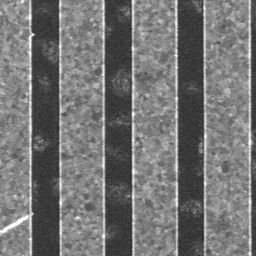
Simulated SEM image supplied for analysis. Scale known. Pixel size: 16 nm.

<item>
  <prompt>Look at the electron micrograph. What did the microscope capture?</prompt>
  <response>one or a few lines or trenches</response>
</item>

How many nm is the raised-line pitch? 1170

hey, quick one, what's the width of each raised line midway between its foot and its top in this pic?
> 699 nanometres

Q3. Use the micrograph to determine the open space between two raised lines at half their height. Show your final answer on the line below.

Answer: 0.467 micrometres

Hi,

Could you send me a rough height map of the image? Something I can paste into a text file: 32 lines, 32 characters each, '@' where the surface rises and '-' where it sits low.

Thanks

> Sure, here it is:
@@@@----@@@@@----@@@@@----@@@@@-
@@@@----@@@@@----@@@@@----@@@@@-
@@@@----@@@@@----@@@@@----@@@@@-
@@@@----@@@@@----@@@@@----@@@@@-
@@@@----@@@@@----@@@@@----@@@@@-
@@@@----@@@@@----@@@@@----@@@@@-
@@@@----@@@@@----@@@@@----@@@@@-
@@@@----@@@@@----@@@@@----@@@@@-
@@@@----@@@@@----@@@@@----@@@@@-
@@@@----@@@@@----@@@@@----@@@@@-
@@@@----@@@@@----@@@@@----@@@@@-
@@@@----@@@@@----@@@@@----@@@@@-
@@@@----@@@@@----@@@@@----@@@@@-
@@@@----@@@@@----@@@@@----@@@@@-
@@@@----@@@@@----@@@@@----@@@@@-
@@@@----@@@@@----@@@@@----@@@@@-
@@@@----@@@@@----@@@@@----@@@@@-
@@@@----@@@@@----@@@@@----@@@@@-
@@@@----@@@@@----@@@@@----@@@@@-
@@@@----@@@@@----@@@@@----@@@@@-
@@@@----@@@@@----@@@@@----@@@@@-
@@@@----@@@@@----@@@@@----@@@@@-
@@@@----@@@@@----@@@@@----@@@@@-
@@@@----@@@@@----@@@@@----@@@@@-
@@@@----@@@@@----@@@@@----@@@@@-
@@@@----@@@@@----@@@@@----@@@@@-
@@@@----@@@@@----@@@@@----@@@@@-
@@@@----@@@@@----@@@@@----@@@@@-
@@@@----@@@@@----@@@@@----@@@@@-
@@@@----@@@@@----@@@@@----@@@@@-
@@@@----@@@@@----@@@@@----@@@@@-
@@@@----@@@@@----@@@@@----@@@@@-